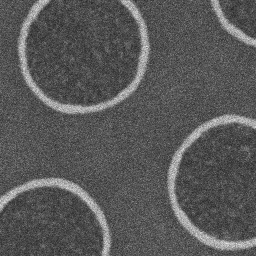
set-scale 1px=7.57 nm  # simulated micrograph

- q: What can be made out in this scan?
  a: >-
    raised bodies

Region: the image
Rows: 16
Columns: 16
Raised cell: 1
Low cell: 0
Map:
0011111100000011
0011111110000011
0111111110000001
0111111110000000
0011111110000000
0011111100000000
0001111000000000
0000000000000010
0000000000001111
0000000000011111
0000000000011111
0011000000011111
1111110000011111
1111110000011111
1111111000001111
1111111000000000